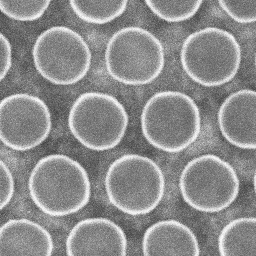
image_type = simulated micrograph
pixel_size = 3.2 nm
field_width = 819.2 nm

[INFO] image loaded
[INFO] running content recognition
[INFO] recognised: a regular array of raised bodies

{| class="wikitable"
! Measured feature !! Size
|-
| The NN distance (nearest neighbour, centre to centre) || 232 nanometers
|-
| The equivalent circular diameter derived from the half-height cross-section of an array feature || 183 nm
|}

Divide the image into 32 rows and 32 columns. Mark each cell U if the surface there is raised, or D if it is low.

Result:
UUUUUUDDDUUUUUUUDDDUUUUUUDDDUUUU
UUUUUDDDDDUUUUUDDDDUUUUUDDDDUUUU
DDDDDDDDDDDUUUDDDDDDDUDDDDDDDUUU
DDDDDDDDDDDDDDDDDDDDDDDDDDDDDDDD
DDDDDUUUUUDDDDUUUUUDDDDDUUUUUDDD
UDDDDUUUUUUDDDUUUUUUDDDUUUUUUUDD
UDDDUUUUUUUDDUUUUUUUDDDUUUUUUUDD
UDDDUUUUUUUDDUUUUUUUDDDUUUUUUUDD
UDDDDUUUUUUDDUUUUUUUDDDUUUUUUUDD
DDDDDUUUUUDDDDUUUUUDDDDDUUUUUDDD
DDDDDDDDDDDDDDDDDDDDDDDDDUUDDDDD
DDDDDDDDDDDDDDDDDDDDDDDDDDDDDDUU
DUUUUDDDDDUUUUDDDDDUUUUUDDDDUUUU
UUUUUUDDDUUUUUUDDDUUUUUUDDDDUUUU
UUUUUUDDDUUUUUUUDDUUUUUUUDDUUUUU
UUUUUUDDDUUUUUUUDDUUUUUUUDDUUUUU
UUUUUUDDDUUUUUUDDDUUUUUUUDDDUUUU
UUUUUDDDDDUUUUUDDDDUUUUUDDDDDUUU
DDUUDDDDDDDDUUDDDDDDUUUDDDDDDDDD
DDDDDDDDDDDDDDDDDDDDDDDDDDDDDDDD
DDDDDUUUUUDDDDUUUUUDDDDDUUUUDDDD
UDDDUUUUUUUDDDUUUUUUDDDUUUUUUDDD
UDDDUUUUUUUDDUUUUUUUDDDUUUUUUUDD
UDDDUUUUUUUDDUUUUUUUDDDUUUUUUUDD
UDDDUUUUUUUDDDUUUUUUDDDUUUUUUDDD
UDDDDUUUUUDDDDUUUUUUDDDDUUUUUDDD
DDDDDDUUUDDDDDDDUUDDDDDDDDDDDDDD
DDDDDDDDDDDDUDDDDDDDDDDDDDDDDDUU
UUUUUDDDDUUUUUUDDDDUUUUDDDDDUUUU
UUUUUUDDDUUUUUUDDDUUUUUUDDDDUUUU
UUUUUUDDDUUUUUUUDDUUUUUUUDDDUUUU
UUUUUUDDDUUUUUUUDDUUUUUUUDDDUUUU